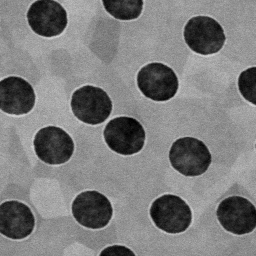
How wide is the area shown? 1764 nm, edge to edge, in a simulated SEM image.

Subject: a regular array of holes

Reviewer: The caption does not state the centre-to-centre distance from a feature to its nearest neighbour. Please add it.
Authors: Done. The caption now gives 60.3 px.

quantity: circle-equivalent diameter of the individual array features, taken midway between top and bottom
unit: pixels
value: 41.6